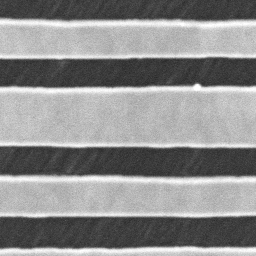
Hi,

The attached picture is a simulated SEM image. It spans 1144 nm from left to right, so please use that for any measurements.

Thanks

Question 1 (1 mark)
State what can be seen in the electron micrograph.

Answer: lines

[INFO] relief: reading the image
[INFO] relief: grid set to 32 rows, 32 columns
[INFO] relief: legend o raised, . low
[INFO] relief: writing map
................................
................................
o...............................
oooooooooooooooooooooooooooooooo
oooooooooooooooooooooooooooooooo
oooooooooooooooooooooooooooooooo
oooooooooooooooooooooooooooooooo
................................
................................
................................
................................
oooooooooooooooooooooooooooooooo
oooooooooooooooooooooooooooooooo
oooooooooooooooooooooooooooooooo
oooooooooooooooooooooooooooooooo
oooooooooooooooooooooooooooooooo
oooooooooooooooooooooooooooooooo
oooooooooooooooooooooooooooooooo
................................
................................
................................
................................
oooooooooooooooooooooooooooooooo
oooooooooooooooooooooooooooooooo
oooooooooooooooooooooooooooooooo
oooooooooooooooooooooooooooooooo
oooooooooooooooooooooooooooooooo
................................
................................
................................
................................
oooooooooooooooooooooooooooooooo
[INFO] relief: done